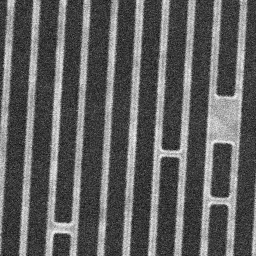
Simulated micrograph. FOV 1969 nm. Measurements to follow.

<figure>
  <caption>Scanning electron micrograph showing parallel lines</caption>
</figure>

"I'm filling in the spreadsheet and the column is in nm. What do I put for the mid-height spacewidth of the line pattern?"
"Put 156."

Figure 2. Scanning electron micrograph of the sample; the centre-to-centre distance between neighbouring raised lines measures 198 nanometers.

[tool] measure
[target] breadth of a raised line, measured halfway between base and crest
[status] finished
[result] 39.3 nm